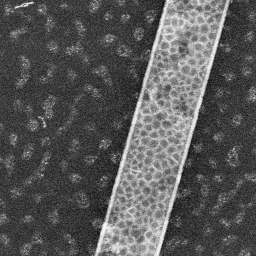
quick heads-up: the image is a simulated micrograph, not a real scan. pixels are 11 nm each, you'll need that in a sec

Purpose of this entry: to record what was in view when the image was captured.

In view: one or a few lines or trenches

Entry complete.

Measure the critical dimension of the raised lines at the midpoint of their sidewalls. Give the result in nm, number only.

634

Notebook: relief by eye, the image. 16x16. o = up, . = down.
..........oooo..
..........oooo..
..........oooo..
..........ooo...
.........oooo...
.........oooo...
.........ooo....
........oooo....
........oooo....
........oooo....
........ooo.....
.......oooo.....
.......oooo.....
.......ooo......
......oooo......
......oooo......